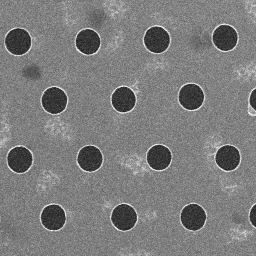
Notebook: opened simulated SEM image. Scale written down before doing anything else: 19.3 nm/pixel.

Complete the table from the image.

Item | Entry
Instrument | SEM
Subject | a regular array of holes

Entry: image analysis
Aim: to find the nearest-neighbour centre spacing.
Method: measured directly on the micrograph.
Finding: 1.31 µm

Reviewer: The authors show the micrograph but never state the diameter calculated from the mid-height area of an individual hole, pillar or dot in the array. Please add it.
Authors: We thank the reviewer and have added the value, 505 nm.